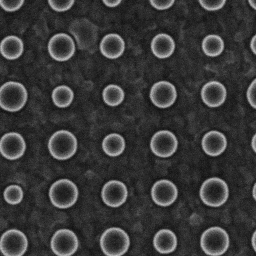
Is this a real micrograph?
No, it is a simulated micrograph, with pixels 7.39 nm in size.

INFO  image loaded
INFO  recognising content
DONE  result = a regular array of raised bodies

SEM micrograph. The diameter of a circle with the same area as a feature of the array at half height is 178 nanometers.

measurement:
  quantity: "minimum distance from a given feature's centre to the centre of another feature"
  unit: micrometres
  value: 0.36